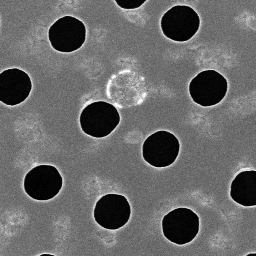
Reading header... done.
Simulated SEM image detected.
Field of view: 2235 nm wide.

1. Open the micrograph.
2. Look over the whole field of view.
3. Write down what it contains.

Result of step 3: a regular array of holes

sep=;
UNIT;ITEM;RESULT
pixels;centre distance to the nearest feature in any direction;70.3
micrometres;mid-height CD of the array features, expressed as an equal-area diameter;0.322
